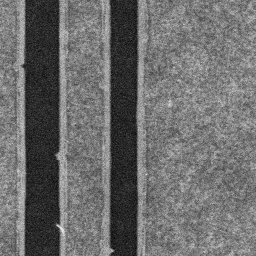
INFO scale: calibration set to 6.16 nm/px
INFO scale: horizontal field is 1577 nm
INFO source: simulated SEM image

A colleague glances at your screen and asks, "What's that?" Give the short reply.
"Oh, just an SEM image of one or a few lines or trenches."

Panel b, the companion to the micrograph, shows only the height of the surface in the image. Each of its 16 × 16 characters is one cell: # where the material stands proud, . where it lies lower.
#...###..#######
#...###..#######
#...###..#######
#...###..#######
#...###..#######
#...###..#######
#...###..#######
#...###..#######
#...###..#######
#...###..#######
#...###..#######
#...###..#######
#...###..#######
#...###..#######
#...###..#######
#...###..#######